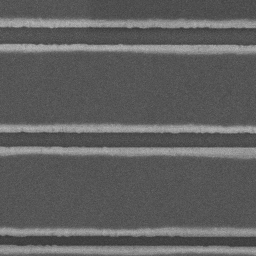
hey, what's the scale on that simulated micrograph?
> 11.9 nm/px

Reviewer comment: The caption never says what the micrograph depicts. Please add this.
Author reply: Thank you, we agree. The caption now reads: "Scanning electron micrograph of lines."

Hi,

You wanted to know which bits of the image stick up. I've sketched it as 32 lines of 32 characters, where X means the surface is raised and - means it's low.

XXXXXXXXXXXXXXXXXXXXXXXXXXXXXXXX
XXXXXXXXXXXXXXXXXXXXXXXXXXXXXXXX
XXXXXXXXXXXXXXXXXXXXXXXXXXXXXXXX
--------------------------------
--------------------------------
--------------------------------
XXXXXXXXXXXXXXXXXXXXXXXXXXXXXXXX
XXXXXXXXXXXXXXXXXXXXXXXXXXXXXXXX
XXXXXXXXXXXXXXXXXXXXXXXXXXXXXXXX
XXXXXXXXXXXXXXXXXXXXXXXXXXXXXXXX
XXXXXXXXXXXXXXXXXXXXXXXXXXXXXXXX
XXXXXXXXXXXXXXXXXXXXXXXXXXXXXXXX
XXXXXXXXXXXXXXXXXXXXXXXXXXXXXXXX
XXXXXXXXXXXXXXXXXXXXXXXXXXXXXXXX
XXXXXXXXXXXXXXXXXXXXXXXXXXXXXXXX
XXXXXXXXXXXXXXXXXXXXXXXXXXXXXXXX
--------------------------------
--------------------------------
--------------------------------
XXXXXXXXXXXXXXXXXXXXXXXXXXXXXXXX
XXXXXXXXXXXXXXXXXXXXXXXXXXXXXXXX
XXXXXXXXXXXXXXXXXXXXXXXXXXXXXXXX
XXXXXXXXXXXXXXXXXXXXXXXXXXXXXXXX
XXXXXXXXXXXXXXXXXXXXXXXXXXXXXXXX
XXXXXXXXXXXXXXXXXXXXXXXXXXXXXXXX
XXXXXXXXXXXXXXXXXXXXXXXXXXXXXXXX
XXXXXXXXXXXXXXXXXXXXXXXXXXXXXXXX
XXXXXXXXXXXXXXXXXXXXXXXXXXXXXXXX
XXXXXXXXXXXXXXXXXXXXXXXXXXXXXXXX
--------------------------------
--------------------------------
XXXXXXXXXXXXXXXXXXXXXXXXXXXXXXXX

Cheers